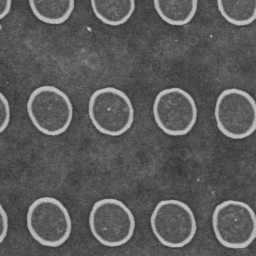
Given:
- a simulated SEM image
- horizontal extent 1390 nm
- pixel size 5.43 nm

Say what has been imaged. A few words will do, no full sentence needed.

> raised bodies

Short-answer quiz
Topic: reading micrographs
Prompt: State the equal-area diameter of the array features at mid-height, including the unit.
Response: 0.233 um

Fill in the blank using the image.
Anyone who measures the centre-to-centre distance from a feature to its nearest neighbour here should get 335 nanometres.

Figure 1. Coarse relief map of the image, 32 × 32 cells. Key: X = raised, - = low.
X---XXXXX---XXXXX---XXXX---XXXXX
X---XXXXX---XXXX----XXXX----XXXX
------XX-----XXX-----XX------XX-
--------------------------------
--------------------------------
--------------------------------
--------------------------------
--------------------------------
--------------------------------
--------------------------------
--------------------------------
-----XX-----XXX------XX------X--
X---XXXX----XXXX----XXXX---XXXX-
X---XXXXX--XXXXX---XXXXX---XXXXX
X---XXXXX--XXXXX----XXXX---XXXXX
X---XXXXX---XXXX----XXXX---XXXXX
------X------XX------XX-----XXX-
--------------------------------
--------------------------------
--------------------------------
--------------------------------
--------------------------------
--------------------------------
--------------------------------
--------------------------------
----XXX-----XXX-----XXX-----XX--
----XXXX----XXXX---XXXXX---XXXX-
X---XXXXX--XXXXXX--XXXXX---XXXXX
X---XXXXX---XXXXX--XXXXX---XXXXX
----XXXX----XXXX----XXXX---XXXXX
--------------X------XX-----XXX-
--------------------------------